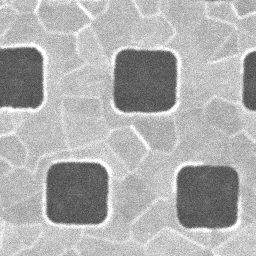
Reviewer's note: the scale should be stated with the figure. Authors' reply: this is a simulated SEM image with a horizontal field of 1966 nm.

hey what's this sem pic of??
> holes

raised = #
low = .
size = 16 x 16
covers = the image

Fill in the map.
################
################
################
...####....####.
...####....####.
...####....####.
..#####....####.
################
################
################
###...#####...##
###....####....#
###....####....#
###....####....#
################
################